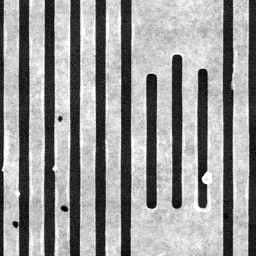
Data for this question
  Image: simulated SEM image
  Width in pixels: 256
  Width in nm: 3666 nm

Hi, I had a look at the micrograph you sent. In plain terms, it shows groups of lines, slits or small figures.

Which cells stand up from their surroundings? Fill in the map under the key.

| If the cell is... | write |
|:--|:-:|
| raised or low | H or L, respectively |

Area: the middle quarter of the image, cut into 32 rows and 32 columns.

HLLLHHHHLLLHHHLLLHHHHHHHHHHLLLHH
HLLLHHHHLLLHHHLLLHHHHHHHHHHLLLHH
HLLLHHHHLLLHHHLLLHHHHLHHHHHLLLHH
HLLLHHHHLLLHHHLLLHHHHLLHHHHLLLHH
HLLLHHHHLLLHHHLLLHHHHLLHHHHLLLHH
HLLLHHHLLLLHHHLLLHHHHLLHHHHLLLHH
HLLLHHHLLLLHHHLLLHHHLLLHHHHLLLHH
HLLLHHHLLLLHHHLLLHHHLLLLHHHLLLHH
HLLLHHHLLLLHHHLLLHHHLLLLHHHLLLHH
HLLLHHHHLLLHHHLLLHHHLLLLHHHLLLHH
HLLLHHHHLLLHHHLLLHHHLLLHHHHLLLHH
HLLLHHHHLLLHHHLLLHHHLLLHHHHLLLHH
HLLLHHHHLLLHHHLLLHHHLLLHHHHLLLHH
HLLLHHHHLLLHHHLLLHHHLLLHHHHLLLHH
HLLLHHHHLLLHHHLLLHHHLLLHHHHLLLHH
HLLLHHHHLLLHHHLLLHHHLLLHHHHLLLHH
HLLLHHHHLLLHHHLLLHHHHLLHHHHLLLHH
HLLLHHHHLLLHHHLLLHHHHLLHHHHLLLHH
HLLLHHHHLLLHHHLLLHHHLLLLHHHLLLHH
HLLLHHHHLLLHHHLLLHHHLLLLHHHLLLHH
HLLLHHHHLLLHHHLLLHHHLLLLHHHLLLHH
HLLLHHHHLLLHHHLLLHHHLLLLHHHLLLHH
HLLLHHHLLLLHHHLLLHHHLLLLHHHLLLHH
HLLLHHHLLLLHHHLLLHHHLLLHHHHLLLHH
HLLLHHHLLLLHHHLLLHHHLLLHHHHLLLHH
HLLLHHHLLLLHHHLLLHHHLLLHHHHLLLHH
HLLLHHHLLLLHHHLLLHHHLLLHHHHLLLHH
HLLLHHHHLLLHHHLLLHHHLLLHHHHLLLHH
HLLLHHHHLLLHHHLLLHHHLLLHHHHLLLHH
HLLLHHHHLLLHHHLLLHHHLLLHHHHLLLHH
HLLLHHHHLLLHHHLLLHHHLLLHHHHLLLHH
HLLLHHHHLLLHHHLLLHHHLLLLHHHLLLHH